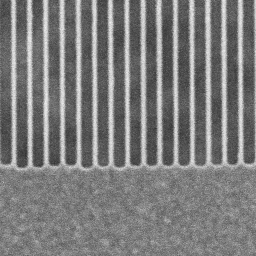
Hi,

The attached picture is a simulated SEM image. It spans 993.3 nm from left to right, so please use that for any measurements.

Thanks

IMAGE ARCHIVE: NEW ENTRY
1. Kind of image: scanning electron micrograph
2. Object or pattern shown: parallel lines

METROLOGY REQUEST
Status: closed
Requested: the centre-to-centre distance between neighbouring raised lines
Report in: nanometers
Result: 62.8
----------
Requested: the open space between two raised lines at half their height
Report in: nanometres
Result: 49.5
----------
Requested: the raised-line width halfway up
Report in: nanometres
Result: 14.1